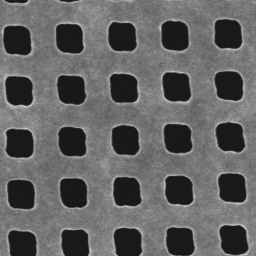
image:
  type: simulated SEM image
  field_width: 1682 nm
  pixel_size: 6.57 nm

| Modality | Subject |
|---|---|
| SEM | a regular array of holes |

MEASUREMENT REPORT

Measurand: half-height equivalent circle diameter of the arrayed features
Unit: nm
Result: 199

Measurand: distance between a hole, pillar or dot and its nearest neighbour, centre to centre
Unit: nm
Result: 336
